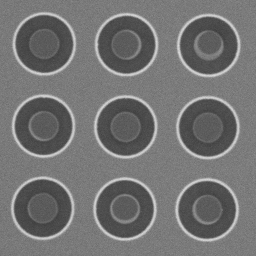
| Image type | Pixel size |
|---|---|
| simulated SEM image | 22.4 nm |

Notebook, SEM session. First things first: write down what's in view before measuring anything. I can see an array of small figures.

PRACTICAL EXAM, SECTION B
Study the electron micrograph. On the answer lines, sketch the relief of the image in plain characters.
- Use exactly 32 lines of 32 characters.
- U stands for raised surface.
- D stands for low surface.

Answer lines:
UUUUUUUUUUUUUUUUUUUUUUUUUUUUUUUU
UUUUUUUUUUUUUUUUUUUUUUUUUUUUUUUU
UUUDDDDDUUUUUUDDDDUUUUUUDDDDUUUU
UUDDDDDDDUUUUDDDDDDUUUUDDDDDDUUU
UUDDUUUDDUUUDDUUUDDUUUUDDUUDDDUU
UUDDUUUDDUUUDDUUUDDDUUDDDUUUDDUU
UUDDUUUDDUUUDDUUUDDUUUDDDUUDDDUU
UUDDDDDDDUUUUDDDDDDUUUUDDDDDDUUU
UUUDDDDDUUUUUDDDDDUUUUUUDDDDDUUU
UUUUUUUUUUUUUUUUUUUUUUUUUUUUUUUU
UUUUUUUUUUUUUUUUUUUUUUUUUUUUUUUU
UUUUUUUUUUUUUUUUUUUUUUUUUUUUUUUU
UUUUDDDUUUUUUUDDDUUUUUUUDDDUUUUU
UUDDDDDDUUUUUDDDDDDUUUUDDDDDDUUU
UUDDUUUDDUUUDDDUUDDUUUDDDUUDDUUU
UUDDUUUDDUUUDDUUUDDUUUDDUUUUDDUU
UUDDUUUDDUUUDDUUUDDUUUDDUUUUDDUU
UUDDDDDDDUUUDDDUDDDUUUUDDUUDDUUU
UUUDDDDDUUUUUDDDDDUUUUUDDDDDDUUU
UUUUUDUUUUUUUUUDDUUUUUUUUDDUUUUU
UUUUUUUUUUUUUUUUUUUUUUUUUUUUUUUU
UUUUUUUUUUUUUUUUUUUUUUUUUUUUUUUU
UUUUDDDUUUUUUUUDUUUUUUUUUDDUUUUU
UUUDDDDDUUUUUDDDDDUUUUUDDDDDUUUU
UUDDUUDDDUUUDDDUDDDUUUUDDDDDDUUU
UUDDUUUDDUUUDDUUUDDUUUDDUUUDDDUU
UUDDUUUDDUUUDDUUUDDUUUDDUUUUDDUU
UUDDUUDDDUUUDDDUDDDUUUDDDUUDDUUU
UUUDDDDDUUUUUDDDDDDUUUUDDDDDDUUU
UUUUDDDUUUUUUUDDDUUUUUUUDDDDUUUU
UUUUUUUUUUUUUUUUUUUUUUUUUUUUUUUU
UUUUUUUUUUUUUUUUUUUUUUUUUUUUUUUU